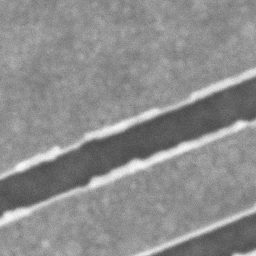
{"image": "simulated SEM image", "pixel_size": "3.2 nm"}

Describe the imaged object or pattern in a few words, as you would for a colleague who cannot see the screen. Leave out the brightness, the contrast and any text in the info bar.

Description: one or a few lines or trenches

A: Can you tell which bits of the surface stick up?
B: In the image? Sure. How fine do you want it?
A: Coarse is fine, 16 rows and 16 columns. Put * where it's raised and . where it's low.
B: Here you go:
****************
****************
****************
****************
****************
**************..
***********.....
*********.......
*******......***
****......******
**.....*********
......**********
...*************
***************.
*************...
**********......